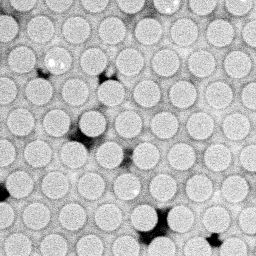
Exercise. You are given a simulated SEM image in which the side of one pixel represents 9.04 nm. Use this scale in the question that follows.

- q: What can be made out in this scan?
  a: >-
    an array of small figures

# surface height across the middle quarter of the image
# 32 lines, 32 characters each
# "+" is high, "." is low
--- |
+...++++++...+++++++..+++++++..+
+....+++++....+++++....+++++....
.......+.......+++......+++.....
................................
.++++.....+++......+++.......++.
++++++...+++++....+++++....+++++
++++++...++++++...++++++...+++++
++++++...++++++...++++++...+++++
++++++...++++++...++++++...+++++
.++++.....++++....+++++....+++++
....................++......+++.
................................
.....++++.....++++......+++.....
+...++++++...++++++...++++++....
+...++++++...++++++...++++++...+
+...++++++...++++++...++++++...+
+...++++++...++++++...++++++...+
.....++++.....++++.....++++.....
................................
................................
+++++....+++++....++++......+++.
+++++....+++++....+++++....+++++
++++++..+++++++..+++++++..++++++
++++++..+++++++..+++++++..++++++
+++++....+++++....+++++...++++++
.+++......+++.....++++.....+++++
................................
......++........................
....+++++....+++++.....++++.....
+...++++++...++++++...++++++...+
+...++++++...++++++...++++++...+
+...++++++...++++++...++++++...+